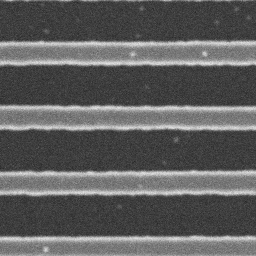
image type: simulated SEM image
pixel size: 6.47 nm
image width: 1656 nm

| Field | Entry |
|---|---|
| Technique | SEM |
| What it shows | lines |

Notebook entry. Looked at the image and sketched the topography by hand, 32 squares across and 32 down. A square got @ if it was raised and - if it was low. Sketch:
--------------------------------
--------------------------------
--------------------------------
--------------------------------
--------------------------------
@@@@@@@@@@@@@@@@@@@@@@@@@@@@@@@@
@@@@@@@@@@@@@@@@@@@@@@@@@@@@@@@@
@@@@@@@@@@@@@@@@@@@@@@@@@@@@@@@@
--------------------------------
--------------------------------
--------------------------------
--------------------------------
--------------------------------
@@@@@@@@@@@@@@@@@@@@@@@@@@@@@@@@
@@@@@@@@@@@@@@@@@@@@@@@@@@@@@@@@
@@@@@@@@@@@@@@@@@@@@@@@@@@@@@@@@
--------------------------------
--------------------------------
--------------------------------
--------------------------------
--------------------------------
------------------------@------@
@@@@@@@@@@@@@@@@@@@@@@@@@@@@@@@@
@@@@@@@@@@@@@@@@@@@@@@@@@@@@@@@@
--------------------------------
--------------------------------
--------------------------------
--------------------------------
--------------------------------
--------------------------------
@@@@@@@@@@@@@@@@@@@@@@@@@@@@@@@@
@@@@@@@@@@@@@@@@@@@@@@@@@@@@@@@@